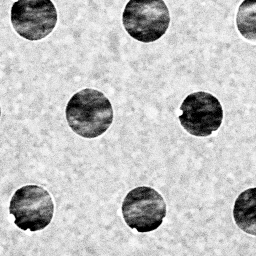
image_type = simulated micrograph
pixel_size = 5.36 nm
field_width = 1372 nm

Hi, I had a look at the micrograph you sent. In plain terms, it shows holes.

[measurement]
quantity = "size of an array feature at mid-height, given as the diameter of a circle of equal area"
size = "248 nm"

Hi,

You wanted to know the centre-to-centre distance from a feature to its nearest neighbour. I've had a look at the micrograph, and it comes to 0.593 micrometres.